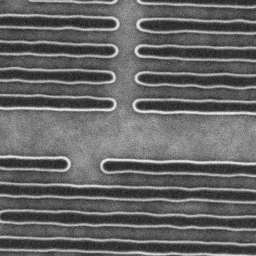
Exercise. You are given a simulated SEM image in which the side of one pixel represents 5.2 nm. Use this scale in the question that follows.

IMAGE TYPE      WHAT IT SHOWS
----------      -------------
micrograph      groups of lines, slits or small figures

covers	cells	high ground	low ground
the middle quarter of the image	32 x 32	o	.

................................
................................
oooooooooooo.......ooooooooooooo
ooooooooooooo.....oooooooooooooo
oooooooooooo......oooooooooooooo
................................
................................
................................
ooooooooo.......................
ooooooooooooo.....oooooooooooooo
ooooooooooooo....ooooooooooooooo
..................oooooooooooooo
................................
................................
................................
................................
................................
................................
................................
................................
................................
................................
................................
................................
o.........oooooooooooooooooooooo
o........ooooooooooooooooooooooo
..........oooooooooooooooooooooo
................................
................................
................................
ooo.............................
oooooooooooooooooooooooooooooooo